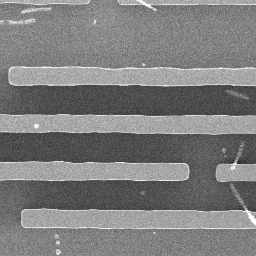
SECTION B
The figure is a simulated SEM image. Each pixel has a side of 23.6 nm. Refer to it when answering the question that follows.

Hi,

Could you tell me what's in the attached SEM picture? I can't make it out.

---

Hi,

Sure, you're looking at groups of lines, slits or small figures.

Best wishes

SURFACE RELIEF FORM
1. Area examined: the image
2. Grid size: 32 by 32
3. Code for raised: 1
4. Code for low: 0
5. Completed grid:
00001100000000011011111110000111
00000000000000000000000000000000
00000000000000000000000000000000
00000000000000000000000000000000
00000000000000000000000000000000
00000000000000000000000000000000
00000000000000000000000000000000
00000000000000000000000000000000
00111111111100000000000000000000
01111111111111111111111111111111
01111111111111111111111111111111
00000000000000000000000000000000
00000000000000000000000000000000
00000000000000000000000000000000
11111111111111111100000111011000
11111111111111111111111111111111
01111100111111011111111111111111
00000000000000000000000000000000
00000000000000000000000000000000
00000000000000000000000000000000
11111111111111111111111000000100
11111111111111111111111100011111
00000011111000001111111000011111
00000000000000000000000000000000
00000000000000000000000000000000
00000000000000000000000000000000
00011111111111111111111111111111
00011111111111111111111111111111
00000000000011100100111100111110
00000000000000000000000000000000
00000000000000000000000000000000
00000000000000000000000000000000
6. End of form